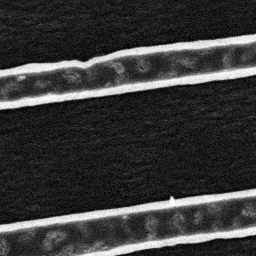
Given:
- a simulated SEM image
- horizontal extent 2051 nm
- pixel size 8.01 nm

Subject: one or a few lines or trenches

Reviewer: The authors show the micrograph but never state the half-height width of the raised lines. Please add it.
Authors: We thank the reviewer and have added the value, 284 nm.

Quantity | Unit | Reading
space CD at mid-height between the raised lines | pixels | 119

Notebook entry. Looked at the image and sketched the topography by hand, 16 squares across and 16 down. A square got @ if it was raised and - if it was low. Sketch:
----------------
----------------
---------------@
-------@@@@@@@@@
@@@@@@@@@@@@@@@@
@@@@@@@@--------
@---------------
----------------
----------------
----------------
----------------
----------------
------------@@@@
-----@@@@@@@@@@@
@@@@@@@@@@@@@@@@
@@@@@@@@--------